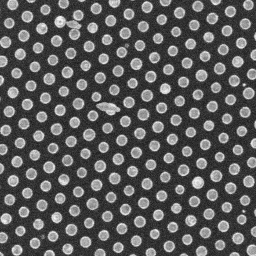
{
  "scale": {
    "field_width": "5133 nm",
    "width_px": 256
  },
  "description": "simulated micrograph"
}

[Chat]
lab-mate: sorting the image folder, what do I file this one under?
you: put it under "a regular array of raised bodies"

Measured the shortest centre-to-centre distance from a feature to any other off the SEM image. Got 0.379 microns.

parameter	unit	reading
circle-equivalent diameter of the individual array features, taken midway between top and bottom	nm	196